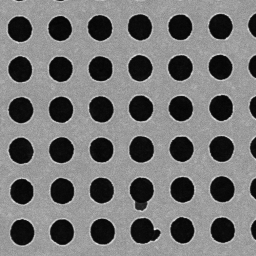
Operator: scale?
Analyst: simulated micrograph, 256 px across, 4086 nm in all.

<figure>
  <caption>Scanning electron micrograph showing a regular array of holes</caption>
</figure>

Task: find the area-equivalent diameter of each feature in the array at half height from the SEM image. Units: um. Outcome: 0.406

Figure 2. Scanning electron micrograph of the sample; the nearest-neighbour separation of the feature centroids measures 637 nm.